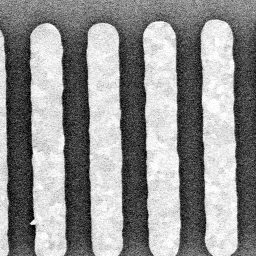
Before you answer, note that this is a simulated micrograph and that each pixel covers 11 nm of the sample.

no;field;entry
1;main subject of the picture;groups of lines, slits or small figures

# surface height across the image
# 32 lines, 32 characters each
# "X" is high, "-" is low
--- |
--------------------------------
--------------------------------
--------------------------------
----XXX----XXX----XXXX---XXXX---
----XXX----XXXX---XXXX---XXXX---
----XXXX---XXXX---XXXX---XXXX---
X---XXXX---XXXX---XXXX---XXXX---
X---XXXX---XXXX---XXXX---XXXX---
X---XXXX---XXXX---XXXX---XXXX---
X---XXXX---XXXX---XXXX---XXXX---
X---XXXX---XXXX---XXXX---XXXX---
X---XXXX---XXXX---XXXX---XXXX---
X---XXXX---XXXX---XXXX---XXXX---
X---XXXX---XXXX---XXXX---XXXX---
X---XXXX---XXXX---XXXX---XXXX---
X---XXXX---XXXX---XXXX---XXXX---
X---XXXX---XXXX---XXXX---XXXX---
X---XXXX---XXXX---XXXX---XXXX---
X---XXXX---XXXX---XXXX----XXX---
X---XXXX---XXXX---XXXX----XXX---
X---XXXX---XXXX---XXXX----XXX---
X---XXXX---XXXX---XXXX----XXX---
X---XXXX---XXXX---XXXX----XXX---
X---XXXX---XXXX---XXXX----XXX---
X---XXXX---XXXX---XXXX----XXXX--
X---XXXX---XXXX---XXXX----XXXX--
X---XXXX---XXXX---XXXX----XXXX--
X---XXXX----XXX----XXX----XXXX--
X---XXXX----XXX----XXX----XXXX--
X---XXXX----XXX----XXX----XXXX--
X---XXXX----XXX----XXX----XXXX--
X---XXXX----XXX----XXX----XXX---